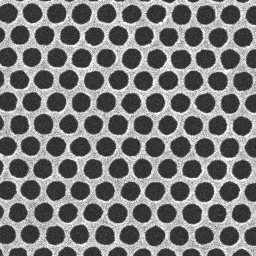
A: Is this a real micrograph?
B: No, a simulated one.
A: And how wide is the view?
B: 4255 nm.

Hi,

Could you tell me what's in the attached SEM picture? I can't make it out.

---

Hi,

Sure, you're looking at a regular array of holes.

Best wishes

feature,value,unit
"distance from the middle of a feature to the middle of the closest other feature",407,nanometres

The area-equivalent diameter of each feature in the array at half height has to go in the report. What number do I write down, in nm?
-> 333